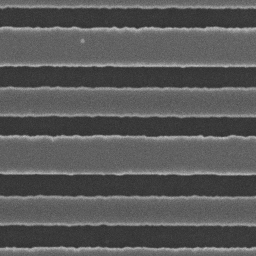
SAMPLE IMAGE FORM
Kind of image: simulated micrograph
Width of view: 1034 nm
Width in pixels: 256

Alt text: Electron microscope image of lines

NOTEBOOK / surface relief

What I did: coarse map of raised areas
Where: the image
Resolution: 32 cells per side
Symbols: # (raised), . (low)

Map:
################################
................................
................................
##.#...#.#........##......##....
################################
################################
################################
################################
................................
................................
................................
################################
################################
################################
######.###.#####################
................................
................................
################################
################################
################################
################################
################################
................................
................................
................................
################################
################################
################################
................................
................................
................................
################################